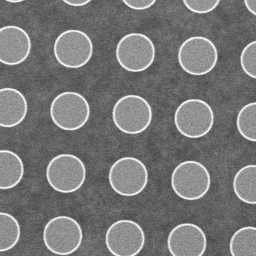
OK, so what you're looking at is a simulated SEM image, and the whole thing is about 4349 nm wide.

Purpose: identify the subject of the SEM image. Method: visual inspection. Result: an array of small figures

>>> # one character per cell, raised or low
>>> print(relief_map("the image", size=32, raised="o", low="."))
.........o......ooo....oooo....o
.........................o.....o
................................
oo..............................
ooo....oooo.....oo..............
oooo...oooo....oooo....oooo....o
oooo...oooo....oooo...ooooo...oo
ooo....oooo....oooo...ooooo...oo
................oo.....ooo....oo
...............................o
................................
oo..............................
ooo....oooo....ooo..............
ooo...ooooo...ooooo...oooo....oo
ooo...ooooo...ooooo...ooooo...oo
oo.....ooo....ooooo...oooo....oo
................o......ooo....oo
...............................o
................................
oo.....oo.......................
ooo...oooo....oooo.....oo.......
ooo...ooooo...oooo....oooo....oo
oo....oooo....oooo....oooo...ooo
o......ooo....oooo....oooo...ooo
.......................oo.....oo
................................
................................
oo.....oo.......................
oo....oooo....oooo....ooo......o
oo....oooo...ooooo...ooooo...ooo
oo....oooo...ooooo...ooooo...ooo
.......oo.....ooo....oooo....ooo